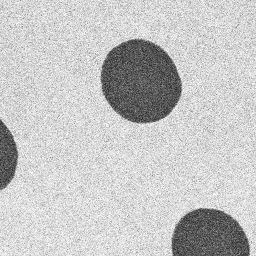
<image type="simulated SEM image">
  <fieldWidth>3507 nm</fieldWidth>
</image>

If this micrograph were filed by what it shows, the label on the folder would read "holes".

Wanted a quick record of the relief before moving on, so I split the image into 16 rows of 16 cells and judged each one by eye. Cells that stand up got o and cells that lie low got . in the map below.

oooooooooooooooo
oooooooooooooooo
oooooooo.ooooooo
ooooooo....ooooo
oooooo.....ooooo
oooooo.....ooooo
ooooooo....ooooo
oooooooo..oooooo
.ooooooooooooooo
.ooooooooooooooo
.ooooooooooooooo
.ooooooooooooooo
oooooooooooooooo
oooooooooooo..oo
ooooooooooo....o
ooooooooooo.....